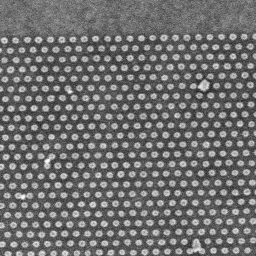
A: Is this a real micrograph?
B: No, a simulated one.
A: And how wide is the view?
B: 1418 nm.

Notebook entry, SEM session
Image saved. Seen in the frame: a regular array of raised bodies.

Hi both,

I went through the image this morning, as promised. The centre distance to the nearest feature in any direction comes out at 60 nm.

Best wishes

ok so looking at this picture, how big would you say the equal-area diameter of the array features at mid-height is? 30.6 nanometres